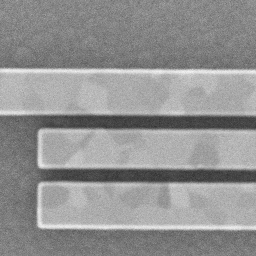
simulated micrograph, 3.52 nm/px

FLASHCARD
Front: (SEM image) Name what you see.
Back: groups of lines, slits or small figures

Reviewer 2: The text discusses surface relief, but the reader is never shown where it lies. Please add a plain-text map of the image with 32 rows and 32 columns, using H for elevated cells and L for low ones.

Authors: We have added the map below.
LLLLLLLLLLLLLLLLLLLLLLLLLLLLLLLL
LLLLLLLLLLLLLLLLLLLLLLLLLLLLLLLL
LLLLLLLLLLLLLLLLLLLLLLLLLLLLLLLL
LLLLLLLLLLLLLLLLLLLLLLLLLLLLLLLL
LLLLLLLLLLLLLLLLLLLLLLLLLLLLLLLL
LLLLLLLLLLLLLLLLLLLLLLLLLLLLLLLL
LLLLLLLLLLLLLLLLLLLLLLLLLLLLLLLL
LLLLLLLLLLLLLLLLLLLLLLLLLLLLLLLL
LLLLLLLLLLLLLLLLLLLLLLLLLLLLLLLL
HHHHHHHHHHHHHHHHHHHHHHHHHHHHHHHH
HHHHHHHHHHHHHHHHHHHHHHHHHHHHHHHH
HHHHHHHHHHHHHHHHHHHHHHHHHHHHHHHH
HHHHHHHHHHHHHHHHHHHHHHHHHHHHHHHH
HHHHHHHHHHHHHHHHHHHHHHHHHHHHHHHH
LLLLLLLLLLLLLLLLLLLLLLLLLLLLLLLL
LLLLLLLLLLLLLLLLLLLLLLLLLLLLLLLL
LLLLLHHHHHHHHHHHHHHHHHHHHHHHHHHH
LLLLLHHHHHHHHHHHHHHHHHHHHHHHHHHH
LLLLLHHHHHHHHHHHHHHHHHHHHHHHHHHH
LLLLLHHHHHHHHHHHHHHHHHHHHHHHHHHH
LLLLLHHHHHHHHHHHHHHHHHHHHHHHHHHH
LLLLLLLLLLLLLLLLLLLLLLLLLLLLLLLL
LLLLLLLLLLLLLLLLLLLLLLLLLLLLLLLL
LLLLLHHHHHHHHHHHHHHHHHHHHHHHHHHH
LLLLLHHHHHHHHHHHHHHHHHHHHHHHHHHH
LLLLLHHHHHHHHHHHHHHHHHHHHHHHHHHH
LLLLLHHHHHHHHHHHHHHHHHHHHHHHHHHH
LLLLLHHHHHHHHHHHHHHHHHHHHHHHHHHH
LLLLLLLLLLLLLLLLLLLLLLLLLLLLLLLL
LLLLLLLLLLLLLLLLLLLLLLLLLLLLLLLL
LLLLLLLLLLLLLLLLLLLLLLLLLLLLLLLL
LLLLLLLLLLLLLLLLLLLLLLLLLLLLLLLL